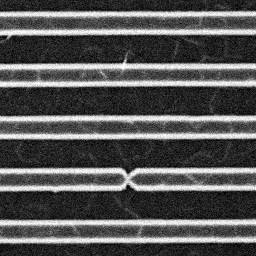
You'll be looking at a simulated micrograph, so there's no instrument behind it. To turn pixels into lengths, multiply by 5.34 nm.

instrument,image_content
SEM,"parallel lines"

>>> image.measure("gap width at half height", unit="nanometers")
176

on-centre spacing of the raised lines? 278 nanometres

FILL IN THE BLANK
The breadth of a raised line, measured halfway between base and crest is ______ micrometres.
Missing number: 0.104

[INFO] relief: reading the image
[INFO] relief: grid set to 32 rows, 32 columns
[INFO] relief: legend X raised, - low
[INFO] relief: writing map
--------------------------------
--------------------------------
XXXXXXXXXXXXXXXXXXXXXXXXXXXXXXXX
XXXXXXXXXXXXXXXXXXXXXXXXXXXXXXXX
--------------------------------
--------------------------------
--------------------------------
--------------------------------
XXXXXXXXXXXXXXXXXXXXXXXXXXXXXXXX
XXXXXXXXXXXXXXXXXXXXXXXXXXXXXXXX
XXXXXXXXXXXXXXXX-------------XXX
--------------------------------
--------------------------------
--------------------------------
--------------------------------
XXXXXXXXXXXXXXXXXXXXXXXXXXXXXXXX
XXXXXXXXXXXXXXXXXXXXXXXXXXXXXXXX
--------------------------------
--------------------------------
--------------------------------
--------------------------------
XXXXXXXXXXXXXXX--XXXXXXXXXXXXXXX
XXXXXXXXXXXXXXXXXXXXXXXXXXXXXXXX
XXXXXXXXXXXXXXX--XXXXXXXXXXXXXXX
--------------------------------
--------------------------------
--------------------------------
--------------------------------
XXXXXXXXXXXXXXXXXXXXXXXXXXXXXXXX
XXXXXXXXXXXXXXXXXXXXXXXXXXXXXXXX
--------------------------------
--------------------------------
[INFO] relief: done